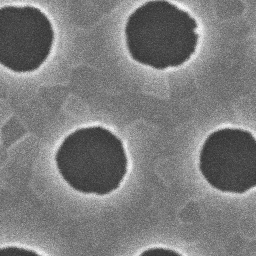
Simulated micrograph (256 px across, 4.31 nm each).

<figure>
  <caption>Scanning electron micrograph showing holes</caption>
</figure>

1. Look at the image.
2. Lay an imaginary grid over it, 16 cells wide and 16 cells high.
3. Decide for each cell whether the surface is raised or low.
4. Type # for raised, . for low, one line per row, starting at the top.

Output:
..#######..#####
...#####....####
...#####....####
...#####....####
#.##############
################
################
################
####...######...
####....#####...
####....#####...
####...######...
################
################
################
.###############